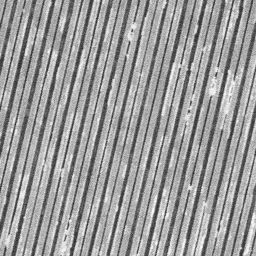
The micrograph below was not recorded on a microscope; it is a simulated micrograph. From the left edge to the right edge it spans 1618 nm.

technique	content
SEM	parallel lines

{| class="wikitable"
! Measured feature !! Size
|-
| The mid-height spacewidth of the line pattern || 23.9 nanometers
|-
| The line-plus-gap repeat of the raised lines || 0.0583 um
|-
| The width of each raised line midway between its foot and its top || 37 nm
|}